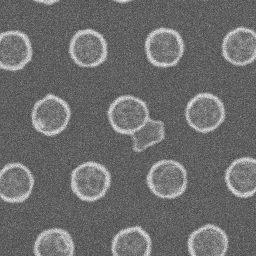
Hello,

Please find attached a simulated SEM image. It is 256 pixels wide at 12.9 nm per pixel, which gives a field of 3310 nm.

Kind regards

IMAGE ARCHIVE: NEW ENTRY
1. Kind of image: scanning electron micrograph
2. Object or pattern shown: raised bodies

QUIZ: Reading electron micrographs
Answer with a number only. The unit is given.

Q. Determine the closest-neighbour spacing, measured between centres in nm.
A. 978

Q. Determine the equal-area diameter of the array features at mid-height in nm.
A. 462